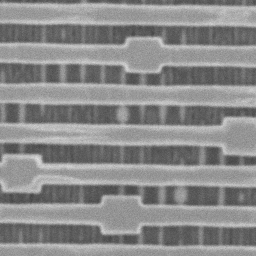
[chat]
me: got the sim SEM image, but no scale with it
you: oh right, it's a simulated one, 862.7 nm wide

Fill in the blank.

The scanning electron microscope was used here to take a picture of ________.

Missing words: wiring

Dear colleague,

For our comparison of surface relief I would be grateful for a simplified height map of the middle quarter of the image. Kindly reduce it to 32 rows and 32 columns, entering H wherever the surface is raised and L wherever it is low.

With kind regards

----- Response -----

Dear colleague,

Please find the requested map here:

LLLLLLLLLLLLLLLHHHHHHHHHHLLLLLLL
LLLLLLLLLLLLLLLLHHHHHHHHLLLLLLLL
LLLLLLLLLLLLLLLLLLLLLLLLLLLLLLLL
LLLLLLLLLLLLLLLLLLLLLLLLLLLLLLLL
LLLLLLLLLLLLLLLLLLLLLLLLLLLLLLLL
HHHHHHHHHHHHHHHHLLLLLLLLLLLLLLLL
HHHHHHHHHHHHHHHHHHHHHHHHHHHHHHHH
HHHHHHHHHHHHHHHHHHHHHHHHHHHHHHHH
HHHHHHHHHHHHHHHHHHHHHHHHHHHHHHHH
HHHHHHHHHHHHHHHHHHHHHHHHHHHHHHHH
LLLLLLLLLLLLLLLLLLLLLLLLLLLLLLLL
LLLLLLLLLLLLLLLLLLLLLLLLLLLLLLLL
LLLLLLLLLLLLLLLLLLLLLLLLLLLLLLLL
LLLLLLLLLLLLLLLLLLLLLLLLLLLLLLLL
LLLLLLLLLLLLLLLLLLLLLLLLLLLLLLLL
HHHHHHHHHHHHHHHHHHHLLLLLLLLLLLLL
HHHHHHHHHHHHHHHHHHHHHHHHHHHHHHHH
HHHHHHHHHHHHHHHHHHHHHHHHHHHHHHHH
HHHHHHHHHHHHHHHHHHHHHHHHHHHHHHHH
HHHHHHHHHHHHHHHHHHHHHHHHHHHHHHHH
LLLLLLLLLLLLLLLLLLLLLLLLLLLLLLLL
LLLLLLLLLLLLLLLLLLLLLLLLLLLLLLLL
LLLLLLLLLLLLLLLLLLLLLLLLLLLLLLLL
LLLLLLLLLLLLLLLLLLLLLLLLLLLLLLLL
LLLLLLLLLLLLLLLLLLLLLLLLLLLLLLLL
HHHHHHHHHHHHHHHHHHHHHHHHHLLLLLLL
HHHHHHHHHHHHHHHHHHHHHHHHHHHHHHHH
HHHHHHHHHHHHHHHHHHHHHHHHHHHHHHHH
HHHHHHHHHHHHHHHHHHHHHHHHHHHHHHHH
HHHHHHHHHHHHHHHHHHHHHHHHHHHHHHHH
LLLLLLLLLLLLLLLLLLLLLLLLLLLLLLLL
LLLLLLLLLLLLLLLLLLLLLLLLLLLLLLLL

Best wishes